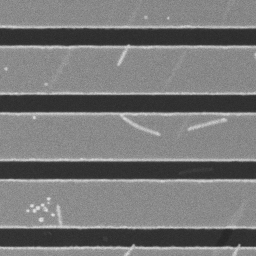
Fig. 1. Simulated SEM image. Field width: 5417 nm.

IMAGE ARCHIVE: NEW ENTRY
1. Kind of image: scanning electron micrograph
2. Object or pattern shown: lines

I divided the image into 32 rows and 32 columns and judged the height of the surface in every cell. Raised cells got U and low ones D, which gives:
UUUUUUUUUUUUUUUUUUUUUUUUUUUUUUUU
UUUUUUUUUUUUUUUUUUUUUUUUUUUUUUUU
UUUUUUUUUUUUUUUUUUUUUUUUUUUUUUUU
DUUUUUUDDUDUUUUUUUUUUUUUUDUUUUUU
DDDDDDDDDDDDDDDDDDDDDDDDDDDDDDDD
DDDDDDDDDDDDDDDDDDDDDDDDDDDDDDDD
UUUUUUUUUUUUUUUUUUUUUUUUUUUUUUUU
UUUUUUUUUUUUUUUUUUUUUUUUUUUUUUUU
UUUUUUUUUUUUUUUUUUUUUUUUUUUUUUUU
UUUUUUUUUUUUUUUUUUUUUUUUUUUUUUUU
UUUUUUUUUUUUUUUUUUUUUUUUUUUUUUUU
UUUUUUUUUUUUUUUUUUUUUUUUUUUUUUUU
DDDDDDDDDDDDDDDDDDDDDDDDDDDDDDDD
DDDDDDDDDDDDDDDDDDDDDDDDDDDDDDDD
UUUUUUUUUUUUUUUUUUUUUUUUUUUUUUUU
UUUUUUUUUUUUUUUUUUUUUUUUUUUUUUUU
UUUUUUUUUUUUUUUUUUUUUUUUUUUUUUUU
UUUUUUUUUUUUUUUUUUUUUUUUUUUUUUUU
UUUUUUUUUUUUUUUUUUUUUUUUUUUUUUUU
UUUUUUUUUUUUUUUUUUUUUUUUUUUUUUUU
DDDDDDDDDDDDDDDDDDDDDDDDDDDDDDDD
DDDDDDDDDDDDDDDDDDDDDDDDDDDDDDDD
UUUUUUUUUUUUUUUUUUUUUUUUUUUUUUUU
UUUUUUUUUUUUUUUUUUUUUUUUUUUUUUUU
UUUUUUUUUUUUUUUUUUUUUUUUUUUUUUUU
UUUUUUUUUUUUUUUUUUUUUUUUUUUUUUUU
UUUUUUUUUUUUUUUUUUUUUUUUUUUUUUUU
UUUUUUUUUUUUUUUUUUUUUUUUUUUUUUUU
DDDDDDDDDDDDDDDDDUUDDDDDUUDUDDDU
DDDDDDDDDDDDDDDDDDDDDDDDDDDDDDDD
DDDDDDDDDDDDDDDDDDDDDDDDDDDDDDDD
UUUUUUUUUUUUUUUUUUUUUUUUUUUUUUUU